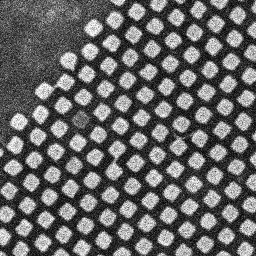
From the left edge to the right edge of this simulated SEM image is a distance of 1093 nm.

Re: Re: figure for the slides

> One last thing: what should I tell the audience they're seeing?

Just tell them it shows a regular array of raised bodies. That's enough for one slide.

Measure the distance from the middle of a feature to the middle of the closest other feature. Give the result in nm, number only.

96.8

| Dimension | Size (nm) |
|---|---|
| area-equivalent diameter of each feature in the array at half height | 64.9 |